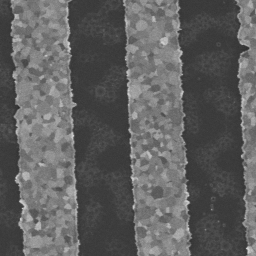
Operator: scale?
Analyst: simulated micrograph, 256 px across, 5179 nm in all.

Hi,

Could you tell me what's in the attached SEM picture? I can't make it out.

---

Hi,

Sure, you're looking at one or a few lines or trenches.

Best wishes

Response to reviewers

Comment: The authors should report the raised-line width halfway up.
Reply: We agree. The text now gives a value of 1090 nm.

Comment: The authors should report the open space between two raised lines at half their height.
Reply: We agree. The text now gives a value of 58.6 pixels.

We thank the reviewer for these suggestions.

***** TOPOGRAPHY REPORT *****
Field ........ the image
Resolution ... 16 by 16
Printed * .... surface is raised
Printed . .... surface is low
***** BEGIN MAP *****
.***....***....*
.***....***....*
.***....***....*
.***....***....*
.***....***....*
.***....***....*
.****...***....*
.***....***....*
.****...***....*
.****...****...*
.****...****...*
.****...****...*
.****...****...*
.****...****...*
.****...****...*
..***....***...*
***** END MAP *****